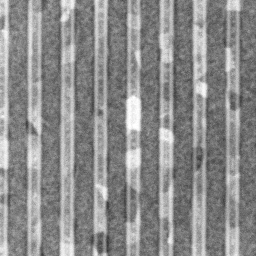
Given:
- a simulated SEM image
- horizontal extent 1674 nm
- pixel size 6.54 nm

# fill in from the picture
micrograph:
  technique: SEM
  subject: parallel lines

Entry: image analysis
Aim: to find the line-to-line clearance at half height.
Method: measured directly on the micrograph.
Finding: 148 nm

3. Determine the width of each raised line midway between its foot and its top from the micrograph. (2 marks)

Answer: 65.4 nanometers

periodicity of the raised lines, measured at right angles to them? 216 nm